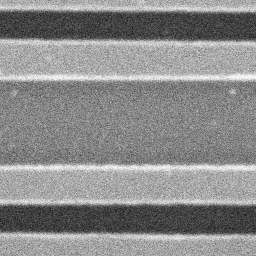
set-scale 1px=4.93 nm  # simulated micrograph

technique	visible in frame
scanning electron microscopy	lines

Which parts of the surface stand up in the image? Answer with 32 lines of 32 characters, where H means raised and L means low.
HHHHHHHHHHHHHHHHHHHHHHHHHHHHHHHH
LLLLLLLLLLLLLLLLLLLLLLLLLLLLLLLL
LLLLLLLLLLLLLLLLLLLLLLLLLLLLLLLL
LLLLLLLLLLLLLLLLLLLLLLLLLLLLLLLL
LLLLLLLLLLLLLLLLLLLLLLLLLLLLLLLL
HHHHHHHHHHHHHHHHHHHHHHHHHHHHHHHH
HHHHHHHHHHHHHHHHHHHHHHHHHHHHHHHH
HHHHHHHHHHHHHHHHHHHHHHHHHHHHHHHH
HHHHHHHHHHHHHHHHHHHHHHHHHHHHHHHH
HHHHHHHHHHHHHHHHHHHHHHHHHHHHHHHH
LLLLLLLLLLLLLLLLLLLLLLLLLLLLLLLL
LLLLLLLLLLLLLLLLLLLLLLLLLLLLLLLL
LLLLLLLLLLLLLLLLLLLLLLLLLLLLLLLL
LLLLLLLLLLLLLLLLLLLLLLLLLLLLLLLL
LLLLLLLLLLLLLLLLLLLLLLLLLLLLLLLL
LLLLLLLLLLLLLLLLLLLLLLLLLLLLLLLL
LLLLLLLLLLLLLLLLLLLLLLLLLLLLLLLL
LLLLLLLLLLLLLLLLLLLLLLLLLLLLLLLL
LLLLLLLLLLLLLLLLLLLLLLLLLLLLLLLL
LLLLLLLLLLLLLLLLLLLLLLLLLLLLLLLL
LLLLLLLLLLLLLLLLLLLLLLLLLLLLLLLL
HHHHHHHHHHHHHHHHHHHHHHHHHHHHHHHH
HHHHHHHHHHHHHHHHHHHHHHHHHHHHHHHH
HHHHHHHHHHHHHHHHHHHHHHHHHHHHHHHH
HHHHHHHHHHHHHHHHHHHHHHHHHHHHHHHH
LLLLLLLLLLLLLLLLLLLLLLLLLLLLLLLL
LLLLLLLLLLLLLLLLLLLLLLLLLLLLLLLL
LLLLLLLLLLLLLLLLLLLLLLLLLLLLLLLL
LLLLLLLLLLLLLLLLLLLLLLLLLLLLLLLL
HHHHHHHHHHHHHHHHHHHHHHHHHHHHHHHH
HHHHHHHHHHHHHHHHHHHHHHHHHHHHHHHH
HHHHHHHHHHHHHHHHHHHHHHHHHHHHHHHH